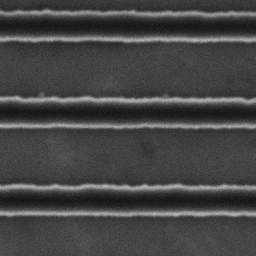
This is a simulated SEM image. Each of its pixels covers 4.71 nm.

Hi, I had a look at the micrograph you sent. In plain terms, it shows lines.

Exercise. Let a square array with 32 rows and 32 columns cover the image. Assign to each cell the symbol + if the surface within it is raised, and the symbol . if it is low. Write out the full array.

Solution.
................................
+.+++++++.++.++++.......+.......
++++++++++++++++++++++++++++++++
++++++++++++++++++++++++++++++++
++++++++++++++++++++++++++++++++
................................
................................
................................
................................
................................
................................
................................
+++++++++++++++++++++++++++++++.
++++++++++++++++++++++++++++++++
++++++++++++++++++++++++++++++++
++++++++++++++++++++++++++++++++
................................
................................
................................
................................
................................
................................
................................
++++++++++++++++++++++++++++++++
++++++++++++++++++++++++++++++++
++++++++++++++++++++++++++++++++
++++++++++++++++++++++++++++++++
................................
................................
................................
................................
................................